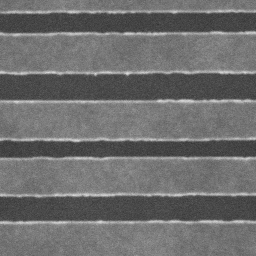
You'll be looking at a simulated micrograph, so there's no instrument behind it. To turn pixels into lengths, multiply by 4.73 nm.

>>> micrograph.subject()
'lines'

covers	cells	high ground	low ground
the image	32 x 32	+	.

++++++++++++++++++++++++++++++++
+++++++.++.+.++++....+...++.....
................................
................................
++++++++++++++++++++++++++++++++
++++++++++++++++++++++++++++++++
++++++++++++++++++++++++++++++++
++++++++++++++++++++++++++++++++
++++++++++++++++++++++++++++++++
................................
................................
................................
................................
++++++++++++++++++++++++++++++++
++++++++++++++++++++++++++++++++
++++++++++++++++++++++++++++++++
++++++++++++++++++++++++++++++++
++++++++++++++++++++++++++++....
................................
................................
++++++++++++++++++++++++++++++++
++++++++++++++++++++++++++++++++
++++++++++++++++++++++++++++++++
++++++++++++++++++++++++++++++++
..+.++..........................
................................
................................
................................
++++++++++++++++++++++++++++++++
++++++++++++++++++++++++++++++++
++++++++++++++++++++++++++++++++
++++++++++++++++++++++++++++++++